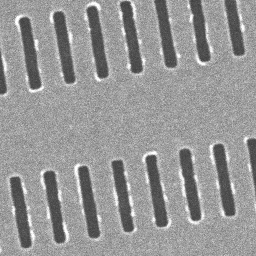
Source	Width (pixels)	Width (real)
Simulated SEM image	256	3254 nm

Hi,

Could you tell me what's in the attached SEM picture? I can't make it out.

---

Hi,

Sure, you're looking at a regular array of holes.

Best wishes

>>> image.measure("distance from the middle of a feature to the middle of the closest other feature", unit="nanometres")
435